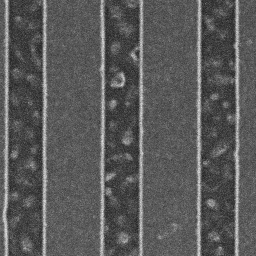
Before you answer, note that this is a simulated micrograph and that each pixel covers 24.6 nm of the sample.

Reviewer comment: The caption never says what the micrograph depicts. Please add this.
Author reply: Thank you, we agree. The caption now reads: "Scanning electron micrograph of one or a few lines or trenches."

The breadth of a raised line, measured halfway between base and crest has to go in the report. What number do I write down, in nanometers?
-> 1420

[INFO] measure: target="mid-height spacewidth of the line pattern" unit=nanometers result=939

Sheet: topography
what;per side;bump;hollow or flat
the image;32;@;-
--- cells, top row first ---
@-----@@@@@@@-----@@@@@@@-----@@
@-----@@@@@@@-----@@@@@@@-----@@
@-----@@@@@@@-----@@@@@@@-----@@
@-----@@@@@@@-----@@@@@@@-----@@
@-----@@@@@@@-----@@@@@@@-----@@
@-----@@@@@@@-----@@@@@@@-----@@
@-----@@@@@@@-----@@@@@@@-----@@
@-----@@@@@@@-----@@@@@@@-----@@
@-----@@@@@@@-----@@@@@@@-----@@
@-----@@@@@@@-----@@@@@@@-----@@
@-----@@@@@@@-----@@@@@@@-----@@
@-----@@@@@@@-----@@@@@@@-----@@
@-----@@@@@@@-----@@@@@@@-----@@
@-----@@@@@@@-----@@@@@@@-----@@
@-----@@@@@@@-----@@@@@@@-----@@
@-----@@@@@@@-----@@@@@@@-----@@
@-----@@@@@@@-----@@@@@@@-----@@
@-----@@@@@@@-----@@@@@@@-----@@
@-----@@@@@@@-----@@@@@@@-----@@
@-----@@@@@@@-----@@@@@@@-----@@
@-----@@@@@@@-----@@@@@@@-----@@
@-----@@@@@@@-----@@@@@@@-----@@
@-----@@@@@@@-----@@@@@@@-----@@
@-----@@@@@@@-----@@@@@@@-----@@
@-----@@@@@@@-----@@@@@@@-----@@
@-----@@@@@@@-----@@@@@@@-----@@
@-----@@@@@@@-----@@@@@@@-----@@
@-----@@@@@@@-----@@@@@@@-----@@
@-----@@@@@@@-----@@@@@@@-----@@
@-----@@@@@@@-----@@@@@@@-----@@
@-----@@@@@@@-----@@@@@@@-----@@
@-----@@@@@@@-----@@@@@@@-----@@